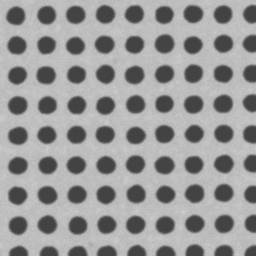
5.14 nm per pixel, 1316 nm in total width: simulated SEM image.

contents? a regular array of holes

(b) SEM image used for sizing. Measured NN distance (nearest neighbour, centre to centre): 0.149 microns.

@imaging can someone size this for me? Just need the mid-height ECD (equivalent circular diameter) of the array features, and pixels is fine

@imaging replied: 18.1